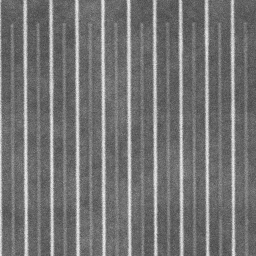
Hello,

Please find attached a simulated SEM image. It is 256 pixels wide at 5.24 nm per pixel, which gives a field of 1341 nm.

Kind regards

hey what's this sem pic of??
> parallel lines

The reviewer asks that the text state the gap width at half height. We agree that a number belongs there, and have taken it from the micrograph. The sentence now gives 56.4 nanometers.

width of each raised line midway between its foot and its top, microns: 0.0098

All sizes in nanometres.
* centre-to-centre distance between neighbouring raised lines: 68